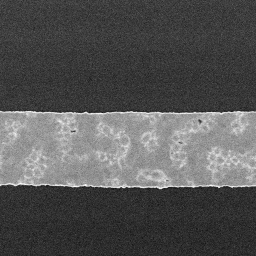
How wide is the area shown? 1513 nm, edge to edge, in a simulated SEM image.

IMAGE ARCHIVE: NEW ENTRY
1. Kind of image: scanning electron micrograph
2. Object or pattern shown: one or a few lines or trenches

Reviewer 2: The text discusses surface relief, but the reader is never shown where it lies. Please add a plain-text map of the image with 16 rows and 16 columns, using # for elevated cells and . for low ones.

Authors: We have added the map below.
................
................
................
................
................
................
................
################
################
################
################
################
................
................
................
................